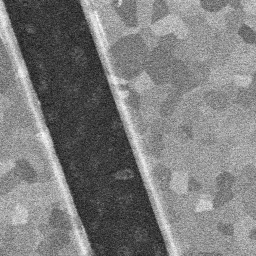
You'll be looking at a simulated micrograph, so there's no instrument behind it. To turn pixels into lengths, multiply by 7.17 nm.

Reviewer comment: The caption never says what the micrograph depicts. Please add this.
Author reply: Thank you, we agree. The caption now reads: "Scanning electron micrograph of one or a few lines or trenches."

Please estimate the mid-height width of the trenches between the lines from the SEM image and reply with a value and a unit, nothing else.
610 nanometers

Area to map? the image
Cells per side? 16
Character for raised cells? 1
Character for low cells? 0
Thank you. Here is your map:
0000001111111111
0000001111111111
1000001111111111
1000000111111111
1000000111111111
1100000111111111
1100000011111111
1100000011111111
1110000011111111
1110000001111111
1110000001111111
1111000001111111
1111000000111111
1111100000111111
1111100000011111
1111100000011111